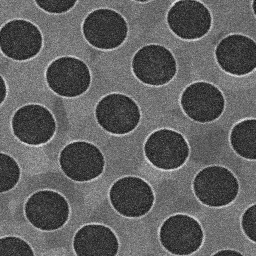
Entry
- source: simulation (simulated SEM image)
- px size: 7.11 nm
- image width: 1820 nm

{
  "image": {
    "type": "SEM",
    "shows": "a regular array of holes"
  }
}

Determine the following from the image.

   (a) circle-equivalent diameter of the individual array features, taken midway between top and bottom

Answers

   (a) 0.305 microns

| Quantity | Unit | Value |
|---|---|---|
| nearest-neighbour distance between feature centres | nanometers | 423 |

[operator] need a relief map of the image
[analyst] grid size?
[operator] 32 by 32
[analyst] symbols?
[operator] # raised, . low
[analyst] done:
#####....#############...#######
######..###....######.....######
##.########.....#####.....######
.....#####......#####.....######
.....######.....######...###...#
.....######....############.....
.....############....######.....
##.####...#######.....#####.....
######.....######.....######....
######.....######.....##########
.#####.....#######...###..######
.######....############.....####
#############....######.....####
###...######.....######.....####
##.....#####......#####....#####
#......#####.....#############..
##.....#######..###...#######...
##....############.....######...
########....######......#####...
.######......#####......######..
..#####......######....#########
...#####.....############....###
..#######..####...######......##
..############.....#####......##
####....######.....######.....##
###......#####.....#######...###
###......######...#############.
####....#############...######..
#####..###....######.....#####..
#########.....######.....######.
....#####......#####.....#######
....#####......######...###...##